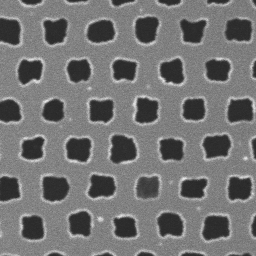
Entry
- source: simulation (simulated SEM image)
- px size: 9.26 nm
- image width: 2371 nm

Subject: a regular array of holes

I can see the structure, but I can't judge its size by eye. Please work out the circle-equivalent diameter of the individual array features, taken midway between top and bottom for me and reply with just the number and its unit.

235 nm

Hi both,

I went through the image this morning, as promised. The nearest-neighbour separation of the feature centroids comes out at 0.409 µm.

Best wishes